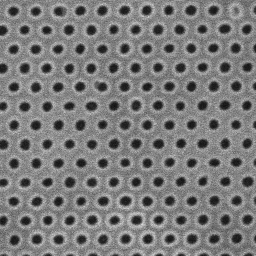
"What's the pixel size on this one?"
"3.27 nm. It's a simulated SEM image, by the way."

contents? a regular array of holes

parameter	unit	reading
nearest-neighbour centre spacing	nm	70.4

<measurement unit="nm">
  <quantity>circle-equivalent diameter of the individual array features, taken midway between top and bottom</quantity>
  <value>33.8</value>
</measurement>